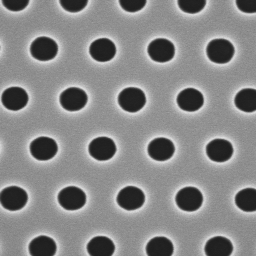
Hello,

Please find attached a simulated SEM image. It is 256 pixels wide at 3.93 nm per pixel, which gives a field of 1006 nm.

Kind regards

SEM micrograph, a regular array of holes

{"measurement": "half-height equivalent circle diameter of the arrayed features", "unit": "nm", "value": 99.2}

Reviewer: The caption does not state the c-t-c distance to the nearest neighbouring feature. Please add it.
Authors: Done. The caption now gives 57.2 pixels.